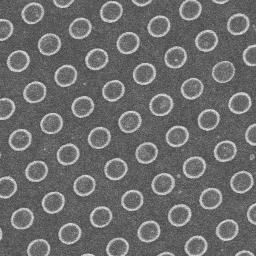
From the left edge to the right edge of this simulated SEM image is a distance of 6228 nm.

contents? a regular array of raised bodies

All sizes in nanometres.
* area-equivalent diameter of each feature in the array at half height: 499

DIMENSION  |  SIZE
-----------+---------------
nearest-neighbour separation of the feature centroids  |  852 nanometers